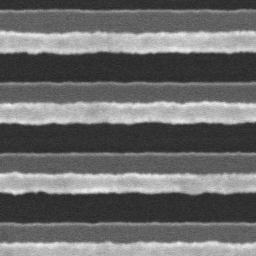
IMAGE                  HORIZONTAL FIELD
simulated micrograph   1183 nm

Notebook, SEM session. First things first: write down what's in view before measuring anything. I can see lines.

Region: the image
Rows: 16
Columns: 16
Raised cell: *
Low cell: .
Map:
................
****************
****************
................
................
****************
****************
****************
................
................
****************
****************
................
................
****************
****************